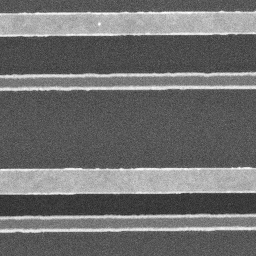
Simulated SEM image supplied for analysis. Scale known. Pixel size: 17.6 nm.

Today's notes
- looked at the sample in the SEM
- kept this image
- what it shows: lines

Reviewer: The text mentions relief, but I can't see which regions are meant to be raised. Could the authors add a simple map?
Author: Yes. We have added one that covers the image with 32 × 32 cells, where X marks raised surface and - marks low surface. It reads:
--------------------------------
---------------------------X-X--
XXXXXXXXXXXXXXXXXXXXXXXXXXXXXXXX
XXXXXXXXXXXXXXXXXXXXXXXXXXXXXXXX
--------------------------------
--------------------------------
--------------------------------
--------------------------------
--------------------------------
XXXXXXXXXXXXXXXXXXXXXXXXXXXXXXXX
XXXXXXXXXXXXXXXXXXXXXXXXXXXXXXXX
--------------------------------
--------------------------------
--------------------------------
--------------------------------
--------------------------------
--------------------------------
--------------------------------
--------------------------------
--------------------------------
--------------------------------
XXXXXXXXXXXXXXXXXXXXXXXXXXXXXXXX
XXXXXXXXXXXXXXXXXXXXXXXXXXXXXXXX
XXXXXXXXXXXXXXXXXXXXXXXXXXXXXXXX
--------------------------------
--------------------------------
--------------------------------
XXXXXXXXXXXXXXXXXXXXXXXXXXXXXXXX
XXXXXXXXXXXXXXXXXXXXXXXXXXXXXXXX
--------------------------------
--------------------------------
--------------------------------